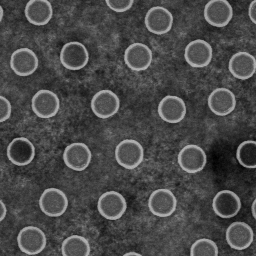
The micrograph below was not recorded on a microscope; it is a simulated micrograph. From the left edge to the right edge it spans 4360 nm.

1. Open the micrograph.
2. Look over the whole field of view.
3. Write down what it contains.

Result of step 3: a regular array of raised bodies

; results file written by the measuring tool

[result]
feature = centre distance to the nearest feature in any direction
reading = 856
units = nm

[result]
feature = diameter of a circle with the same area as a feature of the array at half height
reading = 0.437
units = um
